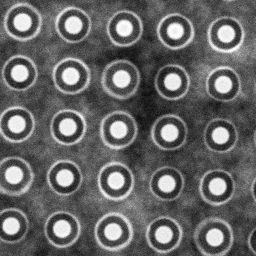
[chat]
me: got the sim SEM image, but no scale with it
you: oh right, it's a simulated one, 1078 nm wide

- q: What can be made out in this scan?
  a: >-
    an array of small figures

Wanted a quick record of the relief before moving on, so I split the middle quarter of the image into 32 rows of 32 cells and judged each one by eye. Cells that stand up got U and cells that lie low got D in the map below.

DDDDDUUUUUUDDDDDDUUUUUUUUUDUUUUU
UUUDDDUUUUUDDDDDDDUUUUUUDDDDDDUU
UUUUDDUUUUDDDUUUDDDUUUUUDDDDDDDU
UUUUDDUUUUDDUUUUDDDUUUUDDUUUUDDU
UUUDDDUUUUDDDUUUDDUUUUUDDUUUUDDU
DDDDDUUUUUDDDUUDDDUUUUUDDUUUUDDU
DDDDUUUUUUUDDDDDDDUUUUUUDDUUDDDU
UUUUUUUUUUUUDDDDDUUUUUUUDDDDDDUU
UUUUUUUUUUUUUUUUUUUUUUUUUUDDUUUU
UUUUUUUUUUUUUUUUUUUUUUUUUUUUUUUU
UUUUUUUUUUUUUUUUUUUUUUUUUUUUUUUU
UUUUUUUUUUUUUUUUUUUUUUUUUUUUUUUU
DDDUUUUUUUUUDDDUUUUUUUUUUUUUUUUU
DDDDUUUUUUUDDDDDDUUUUUUUUDDDUUUU
UUUDDUUUUUDDDUDDDUUUUUUDDDDDDDUU
UUUDDUUUUUDDUUUUDDUUUUUDDUUDDDUU
UUUDDUUUUDDDUUUUDDUUUUDDUUUUDDUU
UUDDDUUUUUDDUUUDDDUUUUDDUUUUDDUU
DDDDUUUUUUDDDUDDDUUUUUDDDUUUDDUU
DDDUUUUUUUUDDDDDDUUUUUUDDDDDDDUU
UUUUUUUUUUUUDDDUUUUUUUUUDDDDDUUU
UUUUUUUUUUUUUUUUUUUUUUUUUUUUUUUU
UUUUUUUUUUUUUUUUUUUUUUUUUUUUUUUU
UUUUUUUUUUUUUUUUUUUUUUUUUUUUUUUU
DUUUUUUUUUUUUUUUUUUUUUUUUUUUUUUU
DDDUUUUUUUUDDDDUUUUUUUUUUUUUUUUU
UDDDUUUUUUDDDDDDUUUUUUUUDDDDUUUU
UUDDUUUUUDDDUUDDDUUUUUUDDDDDDUUU
UUDDUUUUUDDUUUUDDUUUUUDDUUUDDUUU
UUDDUUUUUDDUUUUDDUUUUUDDUUUUDDUU
UDDDUUUUUDDDUUDDDUUUUUDDUUUUDDUU
DDDUUUUUUUDDDDDDUUUUUUDDUUUDDUUU